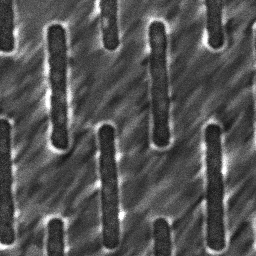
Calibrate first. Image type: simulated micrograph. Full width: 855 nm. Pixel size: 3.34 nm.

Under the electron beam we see holes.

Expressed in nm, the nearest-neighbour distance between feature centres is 344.